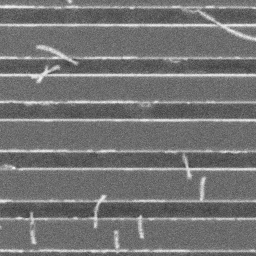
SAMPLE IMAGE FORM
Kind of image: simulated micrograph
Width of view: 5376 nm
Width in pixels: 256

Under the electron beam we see lines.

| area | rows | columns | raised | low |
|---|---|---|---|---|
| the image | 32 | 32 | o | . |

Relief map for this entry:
oooooooooooooooooooooooooooooooo
................................
................................
oooooooooooooooooooooooooooooooo
oooooooooooooooooooooooooooooooo
oooooooooooooooooooooooooooooooo
oooooooooooooooooooooooooooooooo
................................
................................
oooooooooooooooooooooooooooooooo
oooooooooooooooooooooooooooooooo
oooooooooooooooooooooooooooooooo
oooooooooooooooooooooooooooooooo
................................
................................
oooooooooooooooooooooooooooooooo
oooooooooooooooooooooooooooooooo
oooooooooooooooooooooooooooooooo
oooooooooooooooooooooooooooooooo
................................
................................
oooooooooooooooooooooooooooooooo
oooooooooooooooooooooooooooooooo
oooooooooooooooooooooooooooooooo
oooooooooooooooooooooooooooooooo
................................
................................
oooooooooooooooooooooooooooooooo
oooooooooooooooooooooooooooooooo
oooooooooooooooooooooooooooooooo
oooooooooooooooooooooooooooooooo
................................